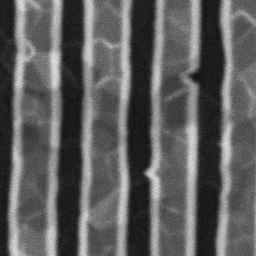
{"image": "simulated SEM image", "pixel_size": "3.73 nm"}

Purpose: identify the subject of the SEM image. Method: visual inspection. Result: one or a few lines or trenches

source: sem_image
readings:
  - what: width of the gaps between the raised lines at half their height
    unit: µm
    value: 0.117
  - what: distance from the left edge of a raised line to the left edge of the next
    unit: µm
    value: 0.258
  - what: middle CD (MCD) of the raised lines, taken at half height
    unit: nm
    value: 142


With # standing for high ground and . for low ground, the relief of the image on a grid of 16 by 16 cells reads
.###..##..##..##
.###..##..##..##
.##...##..##..##
.##..###..##..##
.##..###..##..##
.###.###..##..##
.###.###..##..##
.###.###..##..##
.##..###..##..##
.##..###..##..##
.##..###..##..##
.##..###..##..##
.##..###..##..##
.##..###..##..##
.##..###..##..##
.##..###..##..##